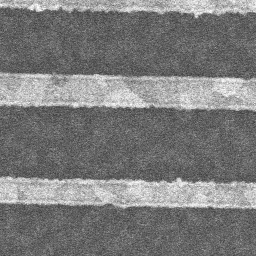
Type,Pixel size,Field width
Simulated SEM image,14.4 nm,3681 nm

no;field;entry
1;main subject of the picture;one or a few lines or trenches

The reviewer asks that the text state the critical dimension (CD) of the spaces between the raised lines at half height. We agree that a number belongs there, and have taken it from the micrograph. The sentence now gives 1060 nanometers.